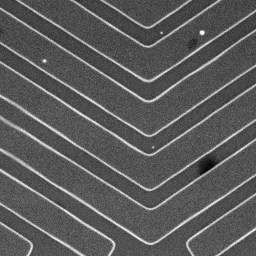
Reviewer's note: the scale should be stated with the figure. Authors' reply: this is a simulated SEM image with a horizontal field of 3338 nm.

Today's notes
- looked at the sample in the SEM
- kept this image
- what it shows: groups of lines, slits or small figures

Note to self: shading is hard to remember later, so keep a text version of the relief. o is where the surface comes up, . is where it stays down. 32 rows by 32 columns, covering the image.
...ooooooo...oooooooooo....ooooo
o...ooooooo....ooooooo...ooooooo
oo....ooooooo....ooo....oooooo..
oooo....oooooo........ooooooo...
ooooo....ooooooo.....oooooo....o
ooooooo....ooooooo.ooooooo...ooo
..ooooooo...oooooooooooo....oooo
...ooooooo....ooooooooo....ooooo
o....ooooooo...oooooo....ooooooo
ooo...ooooooo....ooo...ooooooo..
oooo....ooooooo.......ooooooo...
oooooo....oooooo.....oooooo....o
.ooooooo...ooooooo.ooooooo...ooo
...oooooo....ooooooooooo....oooo
....ooooooo...ooooooooo...oooooo
o....ooooooo....ooooo....oooooo.
ooo....ooooooo...ooo...ooooooo..
ooooo....oooooo.......oooooo....
oooooo....ooooooo...ooooooo...oo
.ooooooo....ooooooooooooo....ooo
...ooooooo...ooooooooooo...ooooo
....ooooooo....oooooooo...oooooo
oo....ooooooo...ooooo...ooooooo.
oooo....oooooo....o....ooooooo..
ooooo....ooooooo......oooooo....
ooooooo....oooooo...ooooooo...oo
..oooooo....ooooooooooooo....ooo
...ooooooo....oooooooooo...ooooo
o....oooooo....ooooooo....oooooo
ooo...ooooooo....oooo...ooooooo.
oooo....oooooo.........oooooo...
oooo......oooo..........oooo....